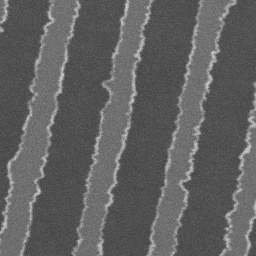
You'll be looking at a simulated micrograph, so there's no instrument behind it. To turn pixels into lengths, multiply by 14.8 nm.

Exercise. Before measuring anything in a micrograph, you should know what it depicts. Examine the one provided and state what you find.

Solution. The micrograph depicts one or a few lines or trenches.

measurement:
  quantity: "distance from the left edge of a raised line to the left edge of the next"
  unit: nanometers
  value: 1070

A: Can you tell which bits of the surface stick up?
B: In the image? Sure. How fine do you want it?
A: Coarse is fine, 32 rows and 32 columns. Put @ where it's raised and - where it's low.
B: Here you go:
-@@@@@----@@@@@@---@@@@@@----@@@
-@@@@@----@@@@@@---@@@@@@---@@@@
@@@@@@@--@@@@@@---@@@@@@@---@@@@
@@@@@@---@@@@@@---@@@@@@@---@@@@
@@@@@@---@@@@@@---@@@@@@---@@@@@
@@@@@---@@@@@@@---@@@@@@---@@@@@
@@@@@---@@@@@@@--@@@@@@@---@@@@@
@@@@@---@@@@@@---@@@@@@@---@@@@@
@@@@@---@@@@@@---@@@@@@@--@@@@@@
@@@@@---@@@@@@---@@@@@@---@@@@@@
@@@@---@@@@@@----@@@@@@---@@@@@@
@@@@---@@@@@@@---@@@@@@---@@@@@@
@@@@---@@@@@@@--@@@@@@@--@@@@@@@
@@@@---@@@@@@---@@@@@@@--@@@@@@@
@@@@---@@@@@@---@@@@@@---@@@@@@-
@@@---@@@@@@@---@@@@@@---@@@@@@@
@@@---@@@@@@@---@@@@@@--@@@@@@@-
@@@---@@@@@@---@@@@@@@---@@@@@@-
@@@---@@@@@@---@@@@@@---@@@@@@@-
@@----@@@@@@---@@@@@@---@@@@@@--
@----@@@@@@@---@@@@@@---@@@@@@--
@----@@@@@@---@@@@@@@---@@@@@@--
@----@@@@@@---@@@@@@@--@@@@@@@--
@----@@@@@@---@@@@@@@--@@@@@@@--
@---@@@@@@@---@@@@@@---@@@@@@---
@---@@@@@@@---@@@@@@---@@@@@@@--
@---@@@@@@---@@@@@@@---@@@@@@---
@---@@@@@@---@@@@@@---@@@@@@@--@
@---@@@@@@---@@@@@@---@@@@@@@--@
---@@@@@@@---@@@@@@---@@@@@@---@
---@@@@@@@---@@@@@@---@@@@@@@--@
---@@@@@@---@@@@@@@---@@@@@@---@